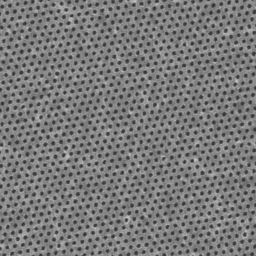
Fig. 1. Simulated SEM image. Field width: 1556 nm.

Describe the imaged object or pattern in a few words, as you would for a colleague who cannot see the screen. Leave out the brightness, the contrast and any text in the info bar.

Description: a regular array of holes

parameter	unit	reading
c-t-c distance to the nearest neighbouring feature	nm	46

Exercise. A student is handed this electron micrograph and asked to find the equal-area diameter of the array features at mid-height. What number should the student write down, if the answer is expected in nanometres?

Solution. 27.4